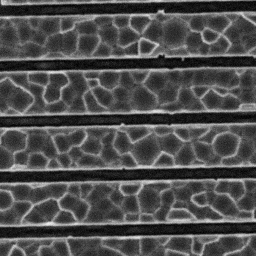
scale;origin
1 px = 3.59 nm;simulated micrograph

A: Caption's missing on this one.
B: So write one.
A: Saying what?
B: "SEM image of parallel lines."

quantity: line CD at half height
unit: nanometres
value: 154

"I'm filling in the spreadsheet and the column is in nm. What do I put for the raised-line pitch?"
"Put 199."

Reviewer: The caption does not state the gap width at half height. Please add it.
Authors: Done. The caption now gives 42.7 nm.